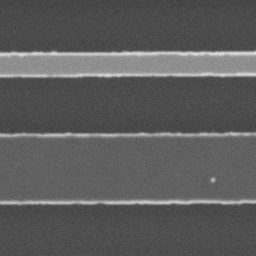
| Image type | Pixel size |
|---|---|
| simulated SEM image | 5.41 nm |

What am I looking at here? lines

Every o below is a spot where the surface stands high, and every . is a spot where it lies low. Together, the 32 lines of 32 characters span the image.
................................
................................
................................
................................
................................
................................
................................
oooooooooooooooooooooooooooooooo
oooooooooooooooooooooooooooooooo
ooooooo.oo......................
................................
................................
................................
................................
................................
................................
................................
oooooooooooooooooooooooooooooooo
oooooooooooooooooooooooooooooooo
oooooooooooooooooooooooooooooooo
oooooooooooooooooooooooooooooooo
oooooooooooooooooooooooooooooooo
oooooooooooooooooooooooooooooooo
oooooooooooooooooooooooooooooooo
oooooooooooooooooooooooooooooooo
................................
................................
................................
................................
................................
................................
................................